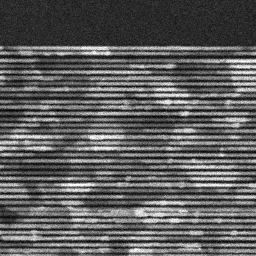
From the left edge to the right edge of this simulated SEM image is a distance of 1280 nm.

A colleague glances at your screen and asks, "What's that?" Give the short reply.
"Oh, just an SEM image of parallel lines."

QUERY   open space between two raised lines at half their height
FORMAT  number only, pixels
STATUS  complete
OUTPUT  2.76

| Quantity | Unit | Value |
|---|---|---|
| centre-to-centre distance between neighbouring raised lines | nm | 29.7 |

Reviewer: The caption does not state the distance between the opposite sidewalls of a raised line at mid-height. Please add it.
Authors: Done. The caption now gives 13.8 nanometers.